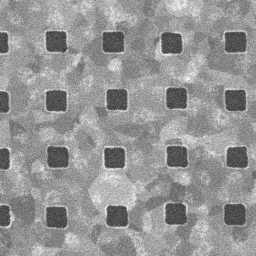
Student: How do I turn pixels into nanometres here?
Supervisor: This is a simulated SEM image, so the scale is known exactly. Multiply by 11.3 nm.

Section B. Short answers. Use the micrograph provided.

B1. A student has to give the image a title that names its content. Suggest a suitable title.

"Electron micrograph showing a regular array of holes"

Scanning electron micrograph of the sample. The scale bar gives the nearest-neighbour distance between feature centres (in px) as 57.3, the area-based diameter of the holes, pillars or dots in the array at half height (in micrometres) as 0.28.